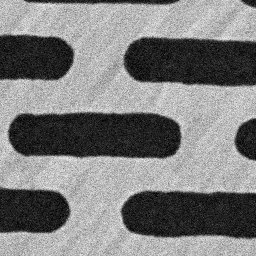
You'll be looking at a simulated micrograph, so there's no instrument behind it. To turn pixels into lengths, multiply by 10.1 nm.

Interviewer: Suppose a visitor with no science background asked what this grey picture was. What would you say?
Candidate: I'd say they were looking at holes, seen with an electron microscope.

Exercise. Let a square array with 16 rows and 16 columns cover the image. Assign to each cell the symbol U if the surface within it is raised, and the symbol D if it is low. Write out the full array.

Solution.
UUUUUUUUUUUUUUUU
UUUUUUUUUUUUUUUU
DDDDUUUUUDDDDDDU
DDDDDUUUDDDDDDDD
DDDDUUUUDDDDDDDD
UUUUUUUUUUUUUUUU
UUUUUUUUUUUUUUUU
UDDDDDDDDDDUUUUD
UDDDDDDDDDDUUUUD
UDDDDDDDDDDUUUUD
UUUUUUUUUUUUUUUU
UUUUUUUUUUUUUUUU
DDDDUUUUDDDDDDDD
DDDDUUUUDDDDDDDD
DDDUUUUUDDDDDDDD
UUUUUUUUUUUUUUUU